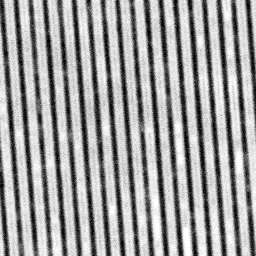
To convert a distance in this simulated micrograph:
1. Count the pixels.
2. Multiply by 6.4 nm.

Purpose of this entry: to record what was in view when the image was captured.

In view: parallel lines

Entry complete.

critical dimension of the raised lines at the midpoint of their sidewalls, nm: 44.6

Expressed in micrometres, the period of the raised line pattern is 0.0925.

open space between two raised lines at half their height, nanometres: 45.4